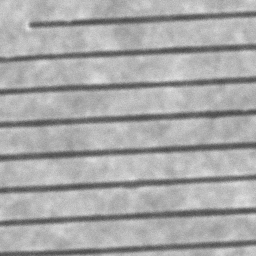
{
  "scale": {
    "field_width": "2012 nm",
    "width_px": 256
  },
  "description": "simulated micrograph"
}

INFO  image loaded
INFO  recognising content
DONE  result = parallel lines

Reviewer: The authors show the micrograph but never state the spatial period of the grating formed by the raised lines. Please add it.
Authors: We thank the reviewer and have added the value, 0.257 microns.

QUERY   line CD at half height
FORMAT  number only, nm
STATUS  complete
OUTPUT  197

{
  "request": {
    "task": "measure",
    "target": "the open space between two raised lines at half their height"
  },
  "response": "59.8 nanometres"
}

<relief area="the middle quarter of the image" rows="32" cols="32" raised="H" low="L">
HHHHHHHHHHHHHHHHHHHHHHHHHHHHHHHH
HHHHHHHHHHHHHHHHHHHHHHHHHHHHHHHH
HHHHHHHHHHHHHHHHHHHHHHHHHHHHHHHH
HHHHHHHHHHHHHHHHHHHHHHHHHHHHHHHH
HHHHHHHHHHHHHHHLLLLLLLLLLLLLLLLL
LLLLLLLLLLLLLLLLLLLLLLLLLLLLLLLL
LLLLLLLLLLLLLLLLLHHHHHHHHHHHHHHH
HHHHHHHHHHHHHHHHHHHHHHHHHHHHHHHH
HHHHHHHHHHHHHHHHHHHHHHHHHHHHHHHH
HHHHHHHHHHHHHHHHHHHHHHHHHHHHHHHH
HHHHHHHHHHHHHHHHHHHHHHHHHHHHHHHH
HHHHHHHHHHHHHHHHHHHHHHHHHHHHHHHH
HHHHHHHHHHHHHHHHHHHLLLLLLLLLLLLL
LLLLLLLLLLLLLLLLLLLLLLLLLLLLLLLL
LLLLLLLLLLLLLLLLLLLLLHHHHHHHHHHH
LHHHHHHHHHHHHHHHHHHHHHHHHHHHHHHH
HHHHHHHHHHHHHHHHHHHHHHHHHHHHHHHH
HHHHHHHHHHHHHHHHHHHHHHHHHHHHHHHH
HHHHHHHHHHHHHHHHHHHHHHHHHHHHHHHH
HHHHHHHHHHHHHHHHHHHHHHHHHHHHHHHH
HHHHHHHHHHHHHHHHHHHHHHHLLLLLLLLL
HHLLLLLLLLLLLLLLLLLLLLLLLLLLLLLL
LLLLLLLLLLLLLLLLLLLLLLLLLHHHHHHH
LLLLLHHHHHHHHHHHHHHHHHHHHHHHHHHH
HHHHHHHHHHHHHHHHHHHHHHHHHHHHHHHH
HHHHHHHHHHHHHHHHHHHHHHHHHHHHHHHH
HHHHHHHHHHHHHHHHHHHHHHHHHHHHHHHH
HHHHHHHHHHHHHHHHHHHHHHHHHHHHHHHH
HHHHHHHHHHHHHHHHHHHHHHHHHHLLLLLL
HHHHHHLLLLLLLLLLLLLLLLLLLLLLLLLL
LLLLLLLLLLLLLLLLLLLLLLLLLLLLHHHH
LLLLLLLLHHHHHHHHHHHHHHHHHHHHHHHH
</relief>